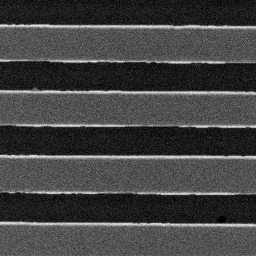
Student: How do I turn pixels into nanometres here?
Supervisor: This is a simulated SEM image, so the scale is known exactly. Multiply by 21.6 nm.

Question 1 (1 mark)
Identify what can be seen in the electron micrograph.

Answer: lines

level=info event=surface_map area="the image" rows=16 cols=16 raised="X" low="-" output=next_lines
----------------
----------------
XXXXXXXXXXXXXXXX
XXXXXXXXXXXXXXXX
----------------
----------------
XXXXXXXXXXXXXXXX
XXXXXXXXXXXXXXXX
----------------
----------------
XXXXXXXXXXXXXXXX
XXXXXXXXXXXXXXXX
----------------
----------------
XXXXXXXXXXXXXXXX
XXXXXXXXXXXXXXXX